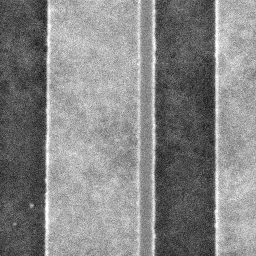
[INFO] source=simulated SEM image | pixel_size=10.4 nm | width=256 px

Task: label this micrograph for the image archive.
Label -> lines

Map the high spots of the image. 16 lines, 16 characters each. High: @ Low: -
---@@@@@@@----@@
---@@@@@@@----@@
---@@@@@@@----@@
---@@@@@@@----@@
---@@@@@@@----@@
---@@@@@@@----@@
---@@@@@@@----@@
---@@@@@@@----@@
---@@@@@@@----@@
---@@@@@@@----@@
---@@@@@@@----@@
---@@@@@@@----@@
---@@@@@@@----@@
---@@@@@@@----@@
---@@@@@@@----@@
---@@@@@@@----@@